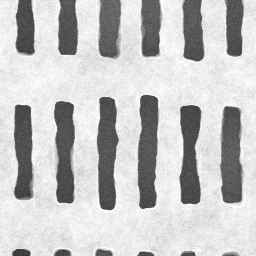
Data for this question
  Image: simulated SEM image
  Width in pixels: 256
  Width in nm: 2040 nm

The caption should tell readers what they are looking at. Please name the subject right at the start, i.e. holes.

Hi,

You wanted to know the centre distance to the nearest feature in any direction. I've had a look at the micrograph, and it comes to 41.1 px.